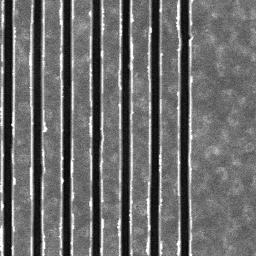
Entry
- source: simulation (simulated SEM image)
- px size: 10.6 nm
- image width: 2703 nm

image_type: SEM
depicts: parallel lines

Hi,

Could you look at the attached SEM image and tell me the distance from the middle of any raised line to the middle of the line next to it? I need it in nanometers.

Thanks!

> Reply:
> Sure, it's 311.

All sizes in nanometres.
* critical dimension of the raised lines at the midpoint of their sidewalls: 219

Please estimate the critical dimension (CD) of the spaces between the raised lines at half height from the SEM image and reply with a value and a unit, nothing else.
93.7 nm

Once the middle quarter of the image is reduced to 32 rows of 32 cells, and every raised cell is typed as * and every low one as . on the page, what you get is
..*****..*****...****...*****..*
..*****..*****...****...*****..*
..*****..*****...****...*****..*
..*****..*****...****...*****..*
..*****..*****...****...*****..*
..*****..*****...****...*****..*
..*****..*****...****...*****..*
..*****..*****...****...*****..*
..*****..*****...****...*****..*
..*****..*****...****...*****..*
..*****..*****...****...*****..*
..*****..*****...*****..*****..*
..*****..*****...*****..*****..*
..*****..*****...*****..*****..*
..*****..*****...*****..*****..*
..*****..*****...*****..*****..*
..*****..*****...*****..*****..*
..*****..*****...****...*****..*
..*****...****...****...*****..*
..*****..*****...****...*****..*
..*****..*****...*****..*****..*
..*****..*****...*****..*****..*
..*****..*****...*****..*****..*
..*****..*****...*****..*****..*
..*****..*****...*****..*****..*
..*****..*****...*****..*****..*
..*****..*****...*****..*****..*
..*****..*****...*****..*****..*
..*****..*****...****...*****..*
..*****..*****...****...*****..*
..*****..*****...****...*****..*
..*****..*****...****...*****..*